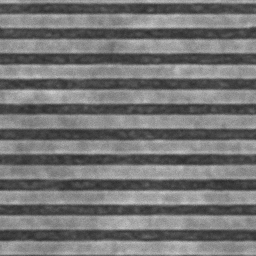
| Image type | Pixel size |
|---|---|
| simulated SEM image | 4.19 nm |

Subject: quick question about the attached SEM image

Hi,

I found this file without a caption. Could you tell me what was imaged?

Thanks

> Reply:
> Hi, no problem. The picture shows parallel lines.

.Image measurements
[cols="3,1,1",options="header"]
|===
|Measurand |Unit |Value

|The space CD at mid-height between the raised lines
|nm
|54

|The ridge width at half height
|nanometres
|54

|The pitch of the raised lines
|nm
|106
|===